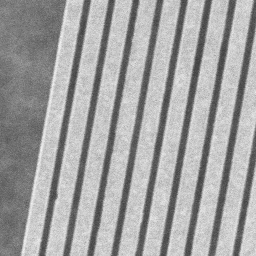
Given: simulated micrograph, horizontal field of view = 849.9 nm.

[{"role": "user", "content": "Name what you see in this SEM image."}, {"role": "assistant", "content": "parallel lines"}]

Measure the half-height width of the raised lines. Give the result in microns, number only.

0.0528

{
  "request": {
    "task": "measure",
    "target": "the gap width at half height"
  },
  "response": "8.37 px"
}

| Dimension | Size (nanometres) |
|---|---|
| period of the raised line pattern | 79.2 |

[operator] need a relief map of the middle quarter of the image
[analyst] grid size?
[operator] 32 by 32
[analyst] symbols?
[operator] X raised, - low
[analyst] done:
XX--XXXX--XXXX--XXXX--XXXX--XXXX
XX--XXXX--XXXX--XXXX--XXXX--XXXX
XX--XXX---XXXX--XXXX--XXXX--XXXX
X--XXXX---XXX--XXXX---XXXX--XXXX
X--XXXX--XXXX--XXXX--XXXX---XXX-
X--XXXX--XXXX--XXXX--XXXX--XXXX-
X--XXXX--XXXX--XXXX--XXXX--XXXX-
X--XXXX--XXXX--XXXX--XXXX--XXXX-
---XXX---XXXX--XXXX--XXXX--XXXX-
--XXXX--XXXX--XXXX---XXXX--XXX--
--XXXX--XXXX--XXXX--XXXX---XXX--
--XXXX--XXXX--XXXX--XXXX--XXXX--
--XXXX--XXXX--XXXX--XXXX--XXXX--
--XXXX--XXXX--XXXX--XXXX--XXXX--
-XXXX---XXXX--XXX---XXXX--XXXX--
-XXXX--XXXX--XXXX---XXX---XXX---
-XXXX--XXXX--XXXX--XXXX---XXX--X
-XXXX--XXXX--XXXX--XXXX--XXXX--X
-XXXX--XXXX--XXXX--XXXX--XXXX--X
-XXX---XXXX--XXXX--XXXX--XXXX--X
-XXX---XXX--XXXX---XXXX--XXX---X
XXXX--XXXX--XXXX--XXXX---XXX---X
XXXX--XXXX--XXXX--XXXX--XXXX--XX
XXXX--XXXX--XXXX--XXXX--XXXX--XX
XXXX--XXXX--XXXX--XXXX--XXXX--XX
XXX---XXXX--XXX---XXXX--XXXX--XX
XXX--XXXX--XXXX---XXX---XXX---XX
XXX--XXXX--XXXX--XXXX---XXX--XXX
XXX--XXXX--XXXX--XXXX--XXXX--XXX
XXX--XXXX--XXXX--XXXX--XXXX--XXX
XX---XXXX--XXXX--XXXX--XXXX--XXX
XX---XXX---XXX---XXXX--XXXX--XXX